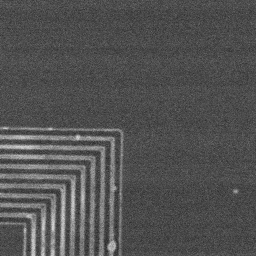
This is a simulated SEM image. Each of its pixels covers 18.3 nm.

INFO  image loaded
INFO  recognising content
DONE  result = groups of lines, slits or small figures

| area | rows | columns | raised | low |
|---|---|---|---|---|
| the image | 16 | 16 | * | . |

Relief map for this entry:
****************
****************
****************
****************
****************
****************
****************
****************
.......*********
.......*********
.......*********
.......*********
.......*********
.......*********
**.....*********
**.....*********